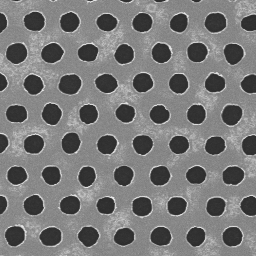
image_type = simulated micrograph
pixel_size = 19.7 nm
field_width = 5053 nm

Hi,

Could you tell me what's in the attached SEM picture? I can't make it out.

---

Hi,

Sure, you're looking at a regular array of holes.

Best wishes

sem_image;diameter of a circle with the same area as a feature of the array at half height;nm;386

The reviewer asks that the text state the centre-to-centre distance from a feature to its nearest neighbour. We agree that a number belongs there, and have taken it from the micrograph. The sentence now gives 687 nm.